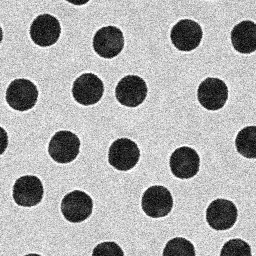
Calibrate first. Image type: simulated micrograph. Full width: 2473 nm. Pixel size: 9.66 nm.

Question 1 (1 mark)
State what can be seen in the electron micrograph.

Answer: a regular array of holes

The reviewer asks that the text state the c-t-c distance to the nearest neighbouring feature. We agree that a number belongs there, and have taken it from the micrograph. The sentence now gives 0.525 um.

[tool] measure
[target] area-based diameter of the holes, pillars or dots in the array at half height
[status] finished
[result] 318 nm